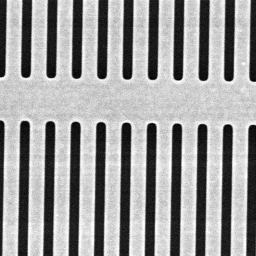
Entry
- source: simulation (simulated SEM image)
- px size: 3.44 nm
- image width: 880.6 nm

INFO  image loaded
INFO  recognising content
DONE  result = groups of lines, slits or small figures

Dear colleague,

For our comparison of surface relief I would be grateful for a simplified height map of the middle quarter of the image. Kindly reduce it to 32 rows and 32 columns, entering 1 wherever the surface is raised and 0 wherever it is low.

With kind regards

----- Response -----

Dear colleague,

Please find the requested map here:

11000111000111100111100111100011
11000111000111100111100111100011
11001111000111100111100111100011
11001111101111100111100111100011
11111111111111111111111111111111
11111111111111111111111111111111
11111111111111111111111111111111
11111111111111111111111111111111
11111111111111111111111111111111
11111111111111111111111111111111
11111111111111111111111111111111
11111111111111111111111111111111
11111111111111111111111111111111
11111111111111111111111111111111
11111111111111111111111111111111
11001111000111000111100111100111
10001111000111000111100111100011
10001111000111000111100111100011
10001111000111000111100111100011
10001111000111000111100111100111
10001111000111000111100111100111
10001111000111000111100111100111
10001111000111000111100111100111
10001111000111000111000111100111
10001111001111000111000111100111
10001111001111000111000111100111
10001111001111000111000111100111
10001111001111000111000111100111
10001111001111000111000111100111
10001111001111000111000111100111
10001111001111000111000111100111
10001111001111000111000111100111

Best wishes